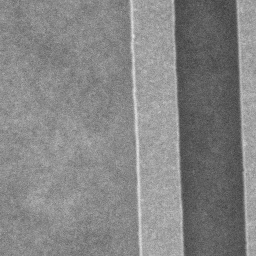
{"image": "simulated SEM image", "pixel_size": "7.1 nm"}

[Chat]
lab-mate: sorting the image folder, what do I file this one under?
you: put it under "one or a few lines or trenches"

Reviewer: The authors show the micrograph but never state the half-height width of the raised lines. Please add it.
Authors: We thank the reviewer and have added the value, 304 nanometres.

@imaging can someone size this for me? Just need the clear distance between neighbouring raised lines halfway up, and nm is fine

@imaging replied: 451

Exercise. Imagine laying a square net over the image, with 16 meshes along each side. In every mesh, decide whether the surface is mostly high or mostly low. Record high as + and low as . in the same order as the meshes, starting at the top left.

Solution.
........+++....+
........+++....+
........+++....+
........+++....+
........+++....+
........+++....+
........+++....+
.........++....+
.........++....+
.........++....+
.........++....+
.........++....+
.........++....+
.........++....+
.........++....+
.........++....+